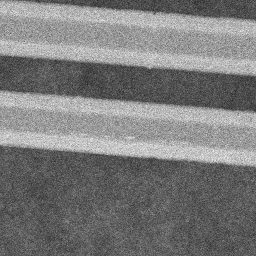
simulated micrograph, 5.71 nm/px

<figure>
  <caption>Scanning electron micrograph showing one or a few lines or trenches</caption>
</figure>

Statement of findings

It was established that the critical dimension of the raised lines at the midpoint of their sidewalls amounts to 225 nm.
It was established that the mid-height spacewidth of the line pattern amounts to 290 nm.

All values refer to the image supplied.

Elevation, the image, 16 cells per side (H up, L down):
LLLLLLLLLLLLLLLL
HHHHHHHHHHHHLLLL
HHHHHHHHHHHHHHHH
LLLLLLLHHHHHHHHH
LLLLLLLLLLLLLLLL
LLLLLLLLLLLLLLLL
HHHHLLLLLLLLLLLL
HHHHHHHHHHHHHHHH
HHHHHHHHHHHHHHHH
LLLLLLLLLLLHHHHH
LLLLLLLLLLLLLLLL
LLLLLLLLLLLLLLLL
LLLLLLLLLLLLLLLL
LLLLLLLLLLLLLLLL
LLLLLLLLLLLLLLLL
LLLLLLLLLLLLLLLL